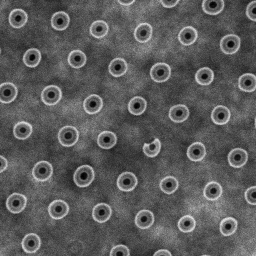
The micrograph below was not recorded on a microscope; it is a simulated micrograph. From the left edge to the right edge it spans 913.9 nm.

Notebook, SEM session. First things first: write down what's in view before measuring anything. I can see a regular array of ring-shaped raised bodies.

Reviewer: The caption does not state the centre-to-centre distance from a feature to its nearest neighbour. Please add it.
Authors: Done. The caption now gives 147 nm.